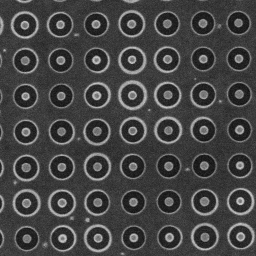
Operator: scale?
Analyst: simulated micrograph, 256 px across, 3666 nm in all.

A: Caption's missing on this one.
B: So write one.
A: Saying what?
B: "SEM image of an array of small figures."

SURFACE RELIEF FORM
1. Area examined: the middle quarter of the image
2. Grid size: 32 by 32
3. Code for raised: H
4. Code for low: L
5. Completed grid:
LLHHHHLLLLLHHHLLLLLLHHHLLLLLHHHH
LHHHHHHLLLHHHHHLLLLHHHHHLLLHHHHH
HHHHHHHHHHHHHHHHHHHHHHHHHHHHHHHH
HHHHHHHHHHHHHHHHHHHHHHHHHHHHHHHH
HHHHHHHHHHHHHHHHHHHHHHHHHHHHHHHH
LHHHHHHLLLHHHHHLLLLHHHHHLLLLHHHH
LLHHHHLLLLLHHHLLLLLLHHHLLLLLLHHH
LLHHHLLLHLLHHHLLHHLLHHHLLHHLLHHH
LLHHHLLLHLLHHHLLLLLLHHHLLHHLLHHH
LLHHHHLLLLLHHHLLLLLLHHHLLLLLHHHH
LHHHHHHLLLHHHHHHLLLHHHHHHLLHHHHH
HHHHHHHHHHHHHHHHHHHHHHHHHHHHHHHH
HHHHHHHHHHHHHHHHHHHHHHHHHHHHHHHH
HHHHHHHHHHHHHHHHHHHHHHHHHHHHHHHH
LHHHHHLLLLHHHHHLLLLHHHHHLLLLHHHH
LLHHHLLLLLLHHHLLLLLLHHHLLLLLLHHH
LLHHHLLHHLLHHHLLHHLLHHHLLHHLLHHH
LLHHHLLLHLLHHHLLLHLLHHHLLLLLLHHH
LLHHHHLLLLLHHHHLLLLLHHHHLLLLHHHH
LHHHHHHLLLHHHHHHLLHHHHHHHLLHHHHH
HHHHHHHHHHHHHHHHHHHHHHHHHHHHHHHH
HHHHHHHHHHHHHHHHHHHHHHHHHHHHHHHH
HHHHHHHHHHHHHHHHHHHHHHHHHHHHHHHH
LHHHHHLLLLHHHHHLLLLHHHHHLLLLHHHH
LLHHHHLLLLLHHHLLLLLLHHHHLLLLLHHH
LLLHHLLLHLLHHHLLHHLLHHHLLHHLLHHH
LLHHHLLLHLLHHHLLLHLLHHHHLLLLLHHH
LLHHHHLLLLLHHHHLLLLLHHHHLLLLHHHH
LHHHHHHLLLHHHHHHLLHHHHHHHHHHHHHH
HHHHHHHHHHHHHHHHHHHHHHHHHHHHHHHH
HHHHHHHHHHHHHHHHHHHHHHHHHHHHHHHH
HHHHHHHHHHHHHHHHHHHHHHHHHHHHHHHH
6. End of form